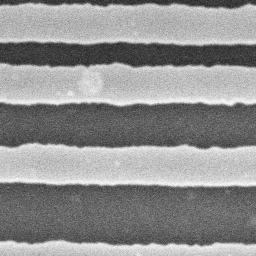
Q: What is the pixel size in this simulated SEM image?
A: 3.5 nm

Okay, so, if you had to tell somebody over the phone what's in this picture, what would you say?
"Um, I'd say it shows lines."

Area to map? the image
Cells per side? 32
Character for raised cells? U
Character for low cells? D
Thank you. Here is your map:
DDDUDDDDDDDDDDDDDDDDDDDDDDDDDDDD
UUUUUUUUUUUUUUUUUUUUUUUUUUUUUUUU
UUUUUUUUUUUUUUUUUUUUUUUUUUUUUUUU
UUUUUUUUUUUUUUUUUUUUUUUUUUUUUUUU
UUUUUUUUUUUUUUUUUUUUUUUUUUUUUUUU
DDDDDDDDDDUUDDDDDDDDDDUUUUDUUUUU
DDDDDDDDDDDDDDDDDDDDDDDDDDDDDDDD
DDDDDDDDDDDDDDDDDDDDDDDDDDDDDDDD
UUUUUUUUUUUUUUUUUUUUUUUUUUUUUUUD
UUUUUUUUUUUUUUUUUUUUUUUUUUUUUUUU
UUUUUUUUUUUUUUUUUUUUUUUUUUUUUUUU
UUUUUUUUUUUUUUUUUUUUUUUUUUUUUUUU
UUUUUUUUUUUUUUUUUUUUUUUUUUUUUUUU
DDDDDDDDDDDDDDDDDDDDDDDDDDDDDDDD
DDDDDDDDDDDDDDDDDDDDDDDDDDDDDDDD
DDDDDDDDDDDDDDDDDDDDDDDDDDDDDDDD
DDDDDDDDDDDDDDDDDDDDDDDDDDDDDDDD
DDDDDDDDDDDDDDDDDDDDDDDDDDDDDDDD
UDUUUUUUUUUUUDDUUUUUUUUUDDUDDDUU
UUUUUUUUUUUUUUUUUUUUUUUUUUUUUUUU
UUUUUUUUUUUUUUUUUUUUUUUUUUUUUUUU
UUUUUUUUUUUUUUUUUUUUUUUUUUUUUUUU
UUUUUUUUUUUUUUUUUUUUUUUUUUUUUUUU
DDDDDDDDDDDDDDDDDDDDDDDDDDDDDDDD
DDDDDDDDDDDDDDDDDDDDDDDDDDDDDDDD
DDDDDDDDDDDDDDDDDDDDDDDDDDDDDDDD
DDDDDDDDDDDDDDDDDDDDDDDDDDDDDDDD
DDDDDDDDDDDDDDDDDDDDDDDDDDDDDDDD
DDDDDDDDDDDDDDDDDDDDDDDDDDDDDDDD
DDDDDDDDDDDDDDDDDDDDDDDDDDDDDDDD
UUUDDUUUUDDDUDDDDDDDDDDDDDDDDDDD
UUUUUUUUUUUUUUUUUUUUUUUUUUUUUUUU